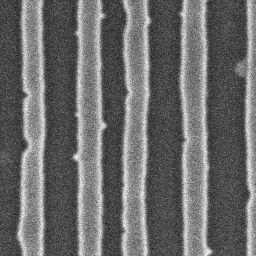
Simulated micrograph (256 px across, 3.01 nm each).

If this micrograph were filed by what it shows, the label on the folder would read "parallel lines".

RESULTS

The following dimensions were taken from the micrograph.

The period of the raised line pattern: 0.163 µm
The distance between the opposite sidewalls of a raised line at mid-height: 0.0644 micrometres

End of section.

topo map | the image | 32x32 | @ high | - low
---@@-----@@@---@@-----@@@-----@
---@@-----@@@---@@-----@@@-----@
---@@-----@@@---@@@----@@@-----@
---@@-----@@----@@-----@@@-----@
---@@-----@@----@@-----@@@-----@
---@@-----@@----@@-----@@@-----@
---@@-----@@----@@-----@@@-----@
---@@-----@@@---@@-----@@@-----@
---@@-----@@@---@@@----@@@-----@
---@@-----@@----@@-----@@@-----@
---@@-----@@----@@-----@@@-----@
---@@-----@@@---@@-----@@@-----@
---@@-----@@@---@@-----@@@-----@
---@@-----@@@---@@-----@@@-----@
---@@-----@@@---@@-----@@@-----@
---@@@----@@@---@@-----@@@-----@
---@@@----@@@---@@-----@@@-----@
---@@-----@@@---@@-----@@@-----@
----@-----@@@---@@-----@@@-----@
---@@----@@@@--@@@-----@@@-----@
---@@-----@@---@@@-----@@@-----@
---@@-----@@@--@@@-----@@@-----@
---@@-----@@@--@@@-----@@@-----@
---@@-----@@@--@@@-----@@@-----@
---@@-----@@@--@@@-----@@@-----@
---@@-----@@@--@@@-----@@@-----@
---@@-----@@@--@@@-----@@@-----@
---@@-----@@@--@@@-----@@@-----@
--@@@-----@@@---@@-----@@@-----@
--@@@-----@@@--@@@-----@@@-----@
---@@-----@@@--@@@-----@@@-----@
---@@-----@@@--@@@-----@@@-----@